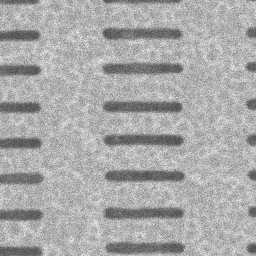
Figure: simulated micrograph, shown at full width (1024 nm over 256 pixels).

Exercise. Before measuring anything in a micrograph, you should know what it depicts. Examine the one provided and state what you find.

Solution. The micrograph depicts holes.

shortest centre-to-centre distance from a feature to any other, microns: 0.139